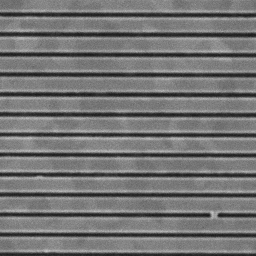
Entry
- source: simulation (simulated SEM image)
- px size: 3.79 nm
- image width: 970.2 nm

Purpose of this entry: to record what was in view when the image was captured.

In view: parallel lines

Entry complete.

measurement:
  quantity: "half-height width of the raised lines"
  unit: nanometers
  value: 53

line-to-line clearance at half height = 22.7 nm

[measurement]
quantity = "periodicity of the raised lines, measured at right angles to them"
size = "75.8 nanometers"